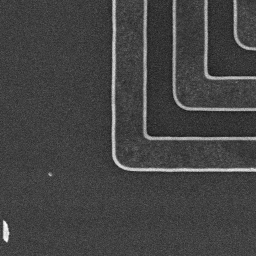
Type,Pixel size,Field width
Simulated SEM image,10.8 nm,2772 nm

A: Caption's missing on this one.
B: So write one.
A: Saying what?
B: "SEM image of groups of lines, slits or small figures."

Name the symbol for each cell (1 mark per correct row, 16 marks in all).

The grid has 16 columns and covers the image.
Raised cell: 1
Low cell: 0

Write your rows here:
0000000110011001
0000000110011001
0000000110011001
0000000110011000
0000000110011000
0000000110011111
0000000110011111
0000000110000000
0000000110000000
0000000111111111
0000000011111111
0000000000000000
0000000000000000
0000000000000000
0000000000000000
0000000000000000